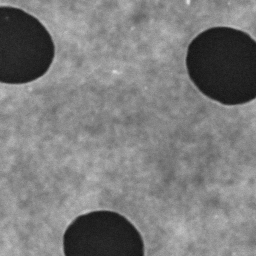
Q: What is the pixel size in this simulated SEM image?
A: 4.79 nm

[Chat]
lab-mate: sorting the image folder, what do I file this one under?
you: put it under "holes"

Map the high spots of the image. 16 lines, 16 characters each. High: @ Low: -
-@@@@@@@@@@@@@@@
---@@@@@@@@@@@@@
---@@@@@@@@@----
---@@@@@@@@@----
---@@@@@@@@@----
@@@@@@@@@@@@----
@@@@@@@@@@@@@@-@
@@@@@@@@@@@@@@@@
@@@@@@@@@@@@@@@@
@@@@@@@@@@@@@@@@
@@@@@@@@@@@@@@@@
@@@@@@@@@@@@@@@@
@@@@@@@@@@@@@@@@
@@@@@---@@@@@@@@
@@@@-----@@@@@@@
@@@@-----@@@@@@@